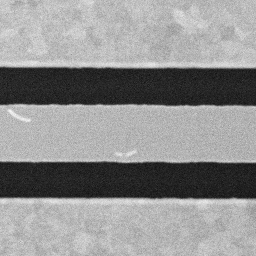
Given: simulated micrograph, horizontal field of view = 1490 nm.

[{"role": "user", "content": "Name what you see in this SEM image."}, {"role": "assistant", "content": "lines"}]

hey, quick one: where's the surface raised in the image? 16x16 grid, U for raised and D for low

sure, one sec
UUUUUUUUUUUUUUUU
UUUUUUUUUUUUUUUU
UUUUUUUUUUUUUUUU
UUUUUUUUUUUUUUUU
DDDDDDDDDDDDDDDD
DDDDDDDDDDDDDDDD
DDDDDDDDDDDDDDDD
UUUUUUUUUUUUUUUU
UUUUUUUUUUUUUUUU
UUUUUUUUUUUUUUUU
DDDDDDDDDDDDDDDD
DDDDDDDDDDDDDDDD
UUUUUUUUUUUUUUUU
UUUUUUUUUUUUUUUU
UUUUUUUUUUUUUUUU
UUUUUUUUUUUUUUUU